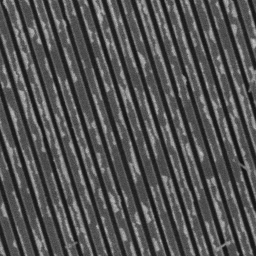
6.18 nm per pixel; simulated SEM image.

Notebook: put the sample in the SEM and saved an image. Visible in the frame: parallel lines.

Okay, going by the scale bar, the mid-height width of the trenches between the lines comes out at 29.5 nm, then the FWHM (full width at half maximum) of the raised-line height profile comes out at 0.0539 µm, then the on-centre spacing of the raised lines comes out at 86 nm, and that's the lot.